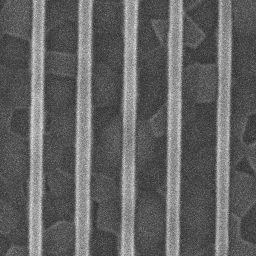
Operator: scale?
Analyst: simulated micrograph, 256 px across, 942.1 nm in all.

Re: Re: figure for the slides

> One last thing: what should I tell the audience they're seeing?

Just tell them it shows parallel lines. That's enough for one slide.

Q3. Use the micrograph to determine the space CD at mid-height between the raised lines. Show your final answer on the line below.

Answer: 129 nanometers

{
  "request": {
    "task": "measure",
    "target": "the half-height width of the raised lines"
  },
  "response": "0.0419 µm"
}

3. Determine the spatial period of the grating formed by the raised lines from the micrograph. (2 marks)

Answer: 172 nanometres